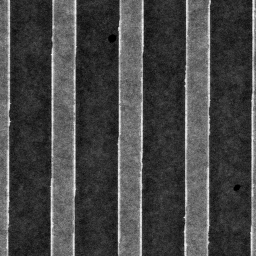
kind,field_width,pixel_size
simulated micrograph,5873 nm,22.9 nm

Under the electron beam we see lines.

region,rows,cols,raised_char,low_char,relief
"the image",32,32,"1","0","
10000001100000011100000111000000
10000001100000011100000111000000
10000001100000011100000111000000
10000001100000011100000111000000
10000001100000011100000111000000
10000001100000011100000111000000
10000001100000011100000111000000
10000001100000011100000111000000
10000001100000011100000111000000
10000001100000011100000111000000
10000001100000011100000111000000
10000001100000011100000111000000
10000001100000011100000111000000
10000001100000011100000111000000
10000001100000011100000111000000
10000001100000011100000111000000
10000001100000011100000111000000
10000001100000011100000111000000
10000001100000011100000111000000
10000001100000011100000111000000
10000001100000011100000111000000
10000001100000011100000111000000
10000011100000011100000111000000
10000011100000011100000111000000
10000011100000011100000111000000
10000011100000011100000111000000
10000011100000011100000111000000
10000011100000011100000111000000
10000011100000011100000111000001
10000011100000011100000111000001
10000011100000011100000111000001
10000011100000011100000111000001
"